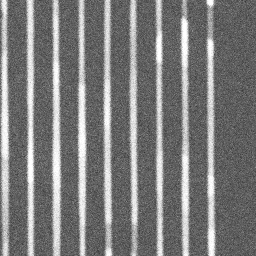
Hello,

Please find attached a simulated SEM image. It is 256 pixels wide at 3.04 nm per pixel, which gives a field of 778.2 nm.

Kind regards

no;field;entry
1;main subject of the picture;parallel lines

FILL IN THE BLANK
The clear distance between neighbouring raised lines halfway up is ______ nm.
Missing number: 63.9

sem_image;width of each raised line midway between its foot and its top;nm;13.7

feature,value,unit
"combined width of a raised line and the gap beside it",0.0783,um